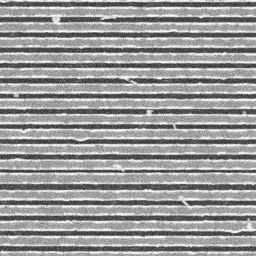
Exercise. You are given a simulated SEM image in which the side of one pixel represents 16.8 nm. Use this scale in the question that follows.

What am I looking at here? parallel lines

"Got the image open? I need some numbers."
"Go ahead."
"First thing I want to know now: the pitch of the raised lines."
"0.256 microns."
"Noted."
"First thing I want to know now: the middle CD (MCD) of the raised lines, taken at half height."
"155 nanometres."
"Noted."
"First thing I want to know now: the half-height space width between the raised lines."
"0.109 um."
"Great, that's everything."